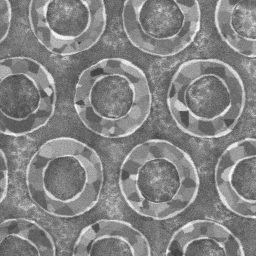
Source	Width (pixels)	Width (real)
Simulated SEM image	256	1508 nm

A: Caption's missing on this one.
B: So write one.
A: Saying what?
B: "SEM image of ring-shaped raised bodies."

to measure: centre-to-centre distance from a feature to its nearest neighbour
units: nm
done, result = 541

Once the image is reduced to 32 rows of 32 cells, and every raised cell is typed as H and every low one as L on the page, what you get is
HLLLHHLLLLLHHLLLHHLLLLHHHLLHHHLL
HLLLHHLLLLLHHLLHHLLLLLLHHLLHHLLL
HLLLHHLLLLLHHLLHHLLLLLLHHLLHHLLL
HLLLHHLLLLLHHLLLHHLLLLLHHLLHHLLL
HLLLHHHLLLHHLLLLHHHLLLHHLLLLHHLL
LLLLLHHHHHHHLLLLLHHHHHHHLLLLLHHH
LLLLLLLHHHLLLLLLLLHHHHLLLLLLLLHH
HHHHLLLLLLLLLHHLLLLLLLLLLLLLLLLL
HHHHHLLLLLLHHHHHHLLLLLLHHHHHHLLL
HLLHHHLLLLHHHLLHHHLLLLHHHLLHHHLL
LLLLHHHLLLHHLLLLHHLLLHHHLLLLHHLL
LLLLLHHLLHHLLLLLLHHLLHHLLLLLLHLL
LLLLLHHLLHHLLLLLLHHLLHHLLLLLLHLL
LLLLLHHLLHHHLLLLHHHLLHHLLLLLLHLL
HLLHHHLLLLHHHLLHHHLLLLHHLLLHHHLL
HHHHHLLLLLLHHHHHHHLLLLHHHHHHHLLL
HHHLLLLLLLLLHHHHLLLLLLLLHHHHLLLL
LLLLLLHHHLLLLLLLLLLLLLLLLLLLLLLH
LLLLLHHHHHHLLLLLLHHHHHLLLLLLLHHH
LLLLHHHHLHHHLLLLHHHHHHHLLLLLHHHH
HLLLHHLLLLHHHLLHHHLLLLHHLLLHHHLL
HLLHHHLLLLLHHLLHHLLLLLHHLLLHHLLL
HLLHHLLLLLLHHLLHHLLLLLLHHLLHHLLL
HLLLHHLLLLHHHLLHHLLLLLHHHLLHHLLL
LLLLHHLLLLHHLLLLHHLLLLHHLLLLHHLL
LLLLLHHHHHHHLLLLHHHHHHHHLLLLHHHH
LLLLLLHHHHHLLLLLLHHHHHLLLLLLLHHH
LHHLLLLLLLLLLHLLLLLLLLLLLLLLLLLL
HHHHHLLLLLLHHHHHHLLLLLLHHHHHLLLL
HLHHHHLLLLHHHHHHHHLLLLHHHHHHHLLL
LLLLHHHLLLHHLLLLHHLLLHHHLLLHHHLL
LLLLLHHLLHHLLLLLLHHLLHHLLLLLHHLL